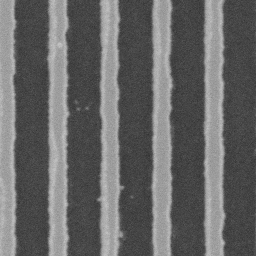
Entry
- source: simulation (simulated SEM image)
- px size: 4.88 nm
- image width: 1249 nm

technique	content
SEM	lines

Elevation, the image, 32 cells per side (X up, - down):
XX----XX-----XX----XX-----XX----
XX----XX-----XX----XX-----XX----
XX----XX-----XX----XX-----XX----
XX----XX-----XX----XX-----XX----
XX----XX-----XX----XX-----XX----
XX----XX-----XX----XX-----XX----
XX----XX-----XX----XX-----XX----
XX----XX-----XX----XX-----XX----
XX----XX-----XX----XX-----XX----
XX----XX-----XX----XX-----XX----
XX----XX-----XX----XXX----XX----
XX----XX-----XX----XX-----XX----
XX----XX-----XX----XX-----XX----
XX----XX-----XX----XX-----XX----
XX----XXX----XX----XX-----XX----
XX----XX-----XX----XX-----XX----
XX----XX-----XX----XX-----XX----
XX----XX-----XX----XX-----XX----
XX----XX-----XX----XX-----XX----
XX----XX-----XX----XX-----XX----
XX----XX-----XX----XX-----XX----
XX----XX-----XX----XX-----XX----
XX----XX-----XX----XX-----XX----
XX----XX-----XX----XX-----XX----
XX----XX-----XX----XX-----XX----
XX----XX-----XX----XX-----XX----
XX----XX-----XX----XX-----XX----
XX----XX-----XX----XX-----XX----
XX----XX-----XX----XX-----XX----
XX----XX-----XX----XX-----XX----
XX----XX-----XX----XX-----XX----
XX----XX-----XX----XX-----XX----